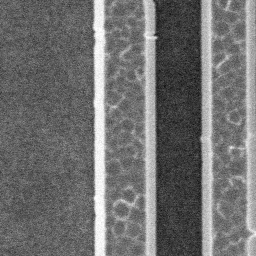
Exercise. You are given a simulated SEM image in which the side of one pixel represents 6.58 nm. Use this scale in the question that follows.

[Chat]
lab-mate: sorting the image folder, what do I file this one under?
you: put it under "one or a few lines or trenches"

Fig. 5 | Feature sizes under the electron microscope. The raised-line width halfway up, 325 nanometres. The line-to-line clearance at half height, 370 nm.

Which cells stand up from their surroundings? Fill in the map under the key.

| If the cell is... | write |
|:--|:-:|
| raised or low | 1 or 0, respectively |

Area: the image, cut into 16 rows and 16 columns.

0000001110000111
0000001110000111
0000001110000111
0000001110000111
0000001110000111
0000001110000111
0000001110000111
0000001110000111
0000001110000111
0000001110000111
0000001110000111
0000001110000111
0000001110000111
0000001110000111
0000001110000111
0000001110000111